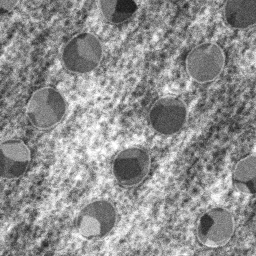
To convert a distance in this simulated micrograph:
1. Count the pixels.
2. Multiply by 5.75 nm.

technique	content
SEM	raised bodies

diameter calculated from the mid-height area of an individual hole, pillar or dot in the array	39.1	px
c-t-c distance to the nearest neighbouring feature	372	nm